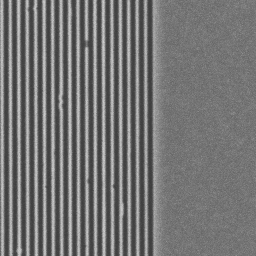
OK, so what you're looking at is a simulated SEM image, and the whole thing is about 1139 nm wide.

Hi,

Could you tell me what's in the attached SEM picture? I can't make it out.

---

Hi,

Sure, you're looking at parallel lines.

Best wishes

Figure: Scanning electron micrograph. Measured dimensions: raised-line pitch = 37.6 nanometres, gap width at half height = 21.7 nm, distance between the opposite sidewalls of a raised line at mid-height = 3.01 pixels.